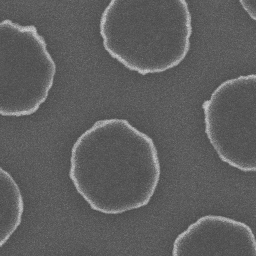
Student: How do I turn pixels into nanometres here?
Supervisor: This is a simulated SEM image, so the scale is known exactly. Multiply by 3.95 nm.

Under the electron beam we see raised bodies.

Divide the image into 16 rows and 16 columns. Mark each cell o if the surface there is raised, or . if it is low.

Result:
.......ooooo...o
o.....oooooo....
ooo...oooooo....
ooo....oooo.....
ooo.............
ooo...........oo
ooo..........ooo
.......o.....ooo
.....oooo....ooo
.....ooooo....oo
....oooooo.....o
o....ooooo......
o....oooo.......
o...............
o..........ooooo
...........ooooo